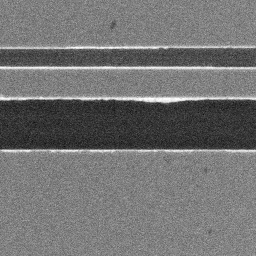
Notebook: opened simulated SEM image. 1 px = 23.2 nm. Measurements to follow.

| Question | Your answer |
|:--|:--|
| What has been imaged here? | lines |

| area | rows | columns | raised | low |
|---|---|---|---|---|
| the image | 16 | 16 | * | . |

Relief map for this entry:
****************
****************
****************
****************
****************
****************
................
................
................
****************
****************
****************
****************
****************
****************
****************